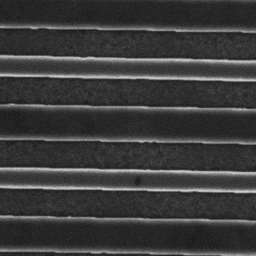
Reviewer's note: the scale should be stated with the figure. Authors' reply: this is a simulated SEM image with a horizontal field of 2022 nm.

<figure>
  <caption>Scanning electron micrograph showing lines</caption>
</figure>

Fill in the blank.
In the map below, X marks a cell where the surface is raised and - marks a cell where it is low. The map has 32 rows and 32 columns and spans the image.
XXXXXXXXXXXXXXXXXXXXXXXXXXXXXXXX
XXXXXXXXXXXXXXXXXXXXXXXXXXXXXXXX
XXXXXXXXXXXXXXXXXXXXXXXXXXXXXXXX
----X-XXXXXXXXXXXXXXXXXXXXXXXXXX
--------------------------------
--------------------------------
--------------------------------
XXXXXXXXXXXXXXXXXXXXXXX---------
XXXXXXXXXXXXXXXXXXXXXXXXXXXXXXXX
--XXXXXXXXXXXXXXXXXXXXXXXXXXXXXX
--------------------------------
--------------------------------
--------------------------------
XXXXXXXXXXXXXXXXXXXXXXXXX-------
XXXXXXXXXXXXXXXXXXXXXXXXXXXXXXXX
XXXXXXXXXXXXXXXXXXXXXXXXXXXXXXXX
XXXXXXXXXXXXXXXXXXXXXXXXXXXXXXXX
-----XXXXXXXXXXXXXXXXXXXXXXXXXXX
--------------------------------
--------------------------------
--------------------------------
XXXXXXXXXXXXXXXXXXXXXXXXXXXX----
XXXXXXXXXXXXXXXXXXXXXXXXXXXXXXXX
-------XXXXXXXXXXXXXXXXXXXXXXXXX
--------------------------------
--------------------------------
--------------------------------
XXXXXXXXXXXXXXXXXXXXXXXXXX------
XXXXXXXXXXXXXXXXXXXXXXXXXXXXXXXX
XXXXXXXXXXXXXXXXXXXXXXXXXXXXXXXX
XXXXXXXXXXXXXXXXXXXXXXXXXXXXXXXX
-----------XXXXXXXXXXXXXXXXXXXXX